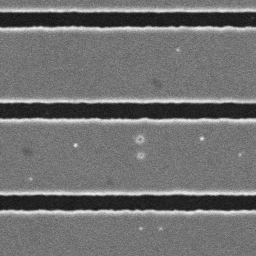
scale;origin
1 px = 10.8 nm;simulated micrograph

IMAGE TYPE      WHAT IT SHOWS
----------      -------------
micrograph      lines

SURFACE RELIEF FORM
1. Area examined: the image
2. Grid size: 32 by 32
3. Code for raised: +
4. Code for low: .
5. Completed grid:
++++++++++++++++++++++++++++++++
................................
................................
++++++++++++++++++++++++++++++++
++++++++++++++++++++++++++++++++
++++++++++++++++++++++++++++++++
++++++++++++++++++++++++++++++++
++++++++++++++++++++++++++++++++
++++++++++++++++++++++++++++++++
++++++++++++++++++++++++++++++++
++++++++++++++++++++++++++++++++
++++++++++++++++++++++++++++++++
++++++++++++++++++++++++++++++++
................................
................................
++++++++++++++++++++++++++++++++
++++++++++++++++++++++++++++++++
++++++++++++++++++++++++++++++++
++++++++++++++++++++++++++++++++
++++++++++++++++++++++++++++++++
++++++++++++++++++++++++++++++++
++++++++++++++++++++++++++++++++
++++++++++++++++++++++++++++++++
++++++++++++++++++++++++++++++++
................................
................................
++++++++++++++++++++++++++++++++
++++++++++++++++++++++++++++++++
++++++++++++++++++++++++++++++++
++++++++++++++++++++++++++++++++
++++++++++++++++++++++++++++++++
++++++++++++++++++++++++++++++++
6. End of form